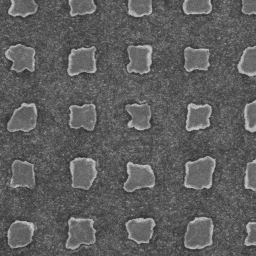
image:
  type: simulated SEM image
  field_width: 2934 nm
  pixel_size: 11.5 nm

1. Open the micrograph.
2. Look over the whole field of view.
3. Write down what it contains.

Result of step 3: a regular array of raised bodies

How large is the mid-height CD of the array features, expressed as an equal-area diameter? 317 nm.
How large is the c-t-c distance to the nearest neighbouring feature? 644 nm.